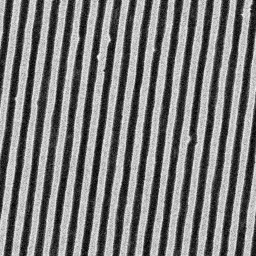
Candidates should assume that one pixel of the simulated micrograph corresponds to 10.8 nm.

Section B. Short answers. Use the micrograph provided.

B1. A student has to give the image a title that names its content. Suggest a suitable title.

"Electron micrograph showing parallel lines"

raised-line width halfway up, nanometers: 80.4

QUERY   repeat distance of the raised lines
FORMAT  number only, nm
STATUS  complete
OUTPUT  165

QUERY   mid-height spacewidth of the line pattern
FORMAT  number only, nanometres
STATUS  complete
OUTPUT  80.4